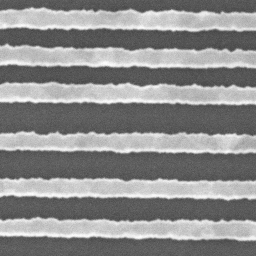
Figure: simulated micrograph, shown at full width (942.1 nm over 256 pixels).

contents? lines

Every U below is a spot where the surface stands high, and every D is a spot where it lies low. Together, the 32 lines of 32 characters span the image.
DDDDDDDDDDDDDDDDDDDDDDDDDDDDDDDD
UUUUUUUUUUUUUDDUUDUDUUUDDDDDDDDD
UUUUUUUUUUUUUUUUUUUUUUUUUUUUUUUU
UDDDUUUUUUUUUUUUUUUUUUUUUUUUUUUU
DDDDDDDDDDDDDDDDDDDDDDDDDDDDDDDD
DDDDDDDDDDDDDDDDDDDDDDDDDDDDDDDD
UUUUUUUUUUUUUUUUUUUUUUUUUUUUUUUU
UUUUUUUUUUUUUUUUUUUUUUUUUUUUUUUU
DDDDDDDDDDDDDDDDDDDDDDDDDDDDDDDD
DDDDDDDDDDDDDDDDDDDDDDDDDDDDDDDD
UUUUUUUDDDDDDDDDDDDDDDDDDDDDDDDD
UUUUUUUUUUUUUUUUUUUUUUUUUUUUUUUU
UUUUUUUUUUUUUUUUUUUUUUUUUUUUUUUU
DDDDDDDDDDDDDDDDDDDDDDDDDDDDDDDD
DDDDDDDDDDDDDDDDDDDDDDDDDDDDDDDD
DDDDDDDDDDDDDDDDDDDDDDDDDDDDDDDD
DDDDDDDDDDDDDDDDDDDDDDDDDDDDDDDD
UUUUUUUUUUUUUUUUUUUUUUUUUUUUUUUU
UUUUUUUUUUUUUUUUUUUUUUUUUUUUUUUU
DDDDDDDDDDDDDDDDDDDDDDDDDDDDDDDD
DDDDDDDDDDDDDDDDDDDDDDDDDDDDDDDD
DDDDDDDDDDDDDDDDDDDDDDDDDDDDDDDD
UDUUUDUUUUUUUUUDDDDDDDDDDDDDDDDD
UUUUUUUUUUUUUUUUUUUUUUUUUUUUUUUU
DDDDDUUUUDDDUUUUUUUUUUUUUUUUUUUU
DDDDDDDDDDDDDDDDDDDDDDDDDDDDDDDD
DDDDDDDDDDDDDDDDDDDDDDDDDDDDDDDD
DUUUUUUDDDUDDDDDDDDDDDDDDDDDDDDD
UUUUUUUUUUUUUUUUUUUUUUUUUUUUUUUU
DDDDDDDUUDUDDUUUUUUUUUUUUUUUUUUU
DDDDDDDDDDDDDDDDDDDDDDDDDDDDDDDD
DDDDDDDDDDDDDDDDDDDDDDDDDDDDDDDD